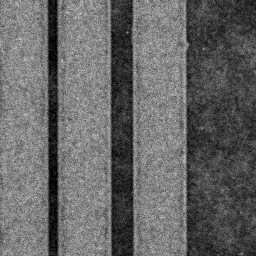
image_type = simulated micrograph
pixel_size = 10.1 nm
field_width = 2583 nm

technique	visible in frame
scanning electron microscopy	one or a few lines or trenches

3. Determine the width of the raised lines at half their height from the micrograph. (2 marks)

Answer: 507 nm